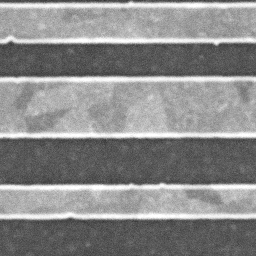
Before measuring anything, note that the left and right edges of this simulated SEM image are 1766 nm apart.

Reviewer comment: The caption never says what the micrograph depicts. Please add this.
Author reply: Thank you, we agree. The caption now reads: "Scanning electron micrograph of one or a few lines or trenches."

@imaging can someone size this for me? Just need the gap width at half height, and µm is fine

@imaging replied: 0.312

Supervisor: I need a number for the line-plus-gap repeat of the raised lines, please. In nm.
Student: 617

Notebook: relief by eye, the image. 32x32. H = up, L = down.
LLLLLLLLLLLLLLLLHLLLLLLLLLLLLLLL
HHHHHHHHHHHHHHHHHHHHHHHHHHHHHHHH
HHHHHHHHHHHHHHHHHHHHHHHHHHHHHHHH
HHHHHHHHHHHHHHHHHHHHHHHHHHHHHHHH
HHHHHHHHHHHHHHHHHHHHHHHHHHHHHHHH
LLLLLLLLLLLLLLLLLLLLLLLLLLLLLLLL
LLLLLLLLLLLLLLLLLLLLLLLLLLLLLLLL
LLLLLLLLLLLLLLLLLLLLLLLLLLLLLLLL
LLLLLLLLLLLLLLLLLLLLLLLLLLLLLLLL
LLLLLLLLLLLLLLLLLLLLLLLLLLLLLLLL
HHHHHHHHHHHHHHHHHHHHHHHHHHHHHHHH
HHHHHHHHHHHHHHHHHHHHHHHHHHHHHHHH
HHHHHHHHHHHHHHHHHHHHHHHHHHHHHHHH
HHHHHHHHHHHHHHHHHHHHHHHHHHHHHHHH
HHHHHHHHHHHHHHHHHHHHHHHHHHHHHHHH
HHHHHHHHHHHHHHHHHHHHHHHHHHHHHHHH
HHHHHHHHHHHHHHHHHHHHHHHHHHHHHHHH
LLLLLLLLLLLLLLLLLLLLLLLLLLLLLLLL
LLLLLLLLLLLLLLLLLLLLLLLLLLLLLLLL
LLLLLLLLLLLLLLLLLLLLLLLLLLLLLLLL
LLLLLLLLLLLLLLLLLLLLLLLLLLLLLLLL
LLLLLLLLLLLLLLLLLLLLLLLLLLLLLLLL
LLLLLLLLLLLLLLLLLLLLLLLLLLLLLLLL
HHHHHHHHHHHHHHHHHHHHHHHHHHHHHHHH
HHHHHHHHHHHHHHHHHHHHHHHHHHHHHHHH
HHHHHHHHHHHHHHHHHHHHHHHHHHHHHHHH
HHHHHHHHHHHHHHHHHHHHHHHHHHHHHHHH
LLLLLLLLLLLLLLLLLLLLLLLLLLLLLLLL
LLLLLLLLLLLLLLLLLLLLLLLLLLLLLLLL
LLLLLLLLLLLLLLLLLLLLLLLLLLLLLLLL
LLLLLLLLLLLLLLLLLLLLLLLLLLLLLLLL
LLLLLLLLLLLLLLLLLLLLLLLLLLLLLLLL